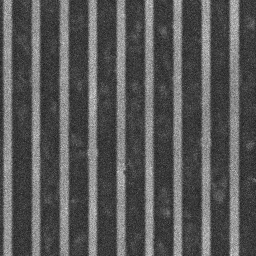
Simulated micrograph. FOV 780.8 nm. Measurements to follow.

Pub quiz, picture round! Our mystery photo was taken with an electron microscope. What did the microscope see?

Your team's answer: parallel lines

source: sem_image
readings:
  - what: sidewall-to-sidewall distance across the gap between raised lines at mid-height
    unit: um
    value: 0.0625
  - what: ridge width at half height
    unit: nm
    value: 23.6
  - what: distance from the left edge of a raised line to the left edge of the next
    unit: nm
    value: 86.4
